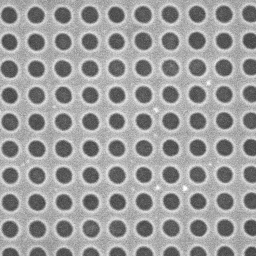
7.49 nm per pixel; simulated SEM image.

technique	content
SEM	a regular array of holes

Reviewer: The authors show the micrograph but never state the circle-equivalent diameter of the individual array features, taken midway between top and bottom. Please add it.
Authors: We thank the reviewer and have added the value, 128 nm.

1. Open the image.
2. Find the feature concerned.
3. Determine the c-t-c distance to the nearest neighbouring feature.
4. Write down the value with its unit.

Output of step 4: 199 nanometers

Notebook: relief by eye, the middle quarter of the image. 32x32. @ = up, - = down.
--@@----@@@----@@@----@@-----@@-
--@@-----@@----@@@----@@@----@@-
--@@@---@@@@---@@@----@@@---@@@@
@@@@@@@@@@@@@@@@@@@@@@@@@@@@@@@@
@@@@@@@@@@@@@@@@@@@@@@@@@@@@@@@@
@@@@@@@@@@@@@@@@@@@-@@@@@@-@@@@@
--@@@---@@@----@@@----@@@---@@@@
--@@-----@@----@@@----@@-----@@-
--@@@----@@----@@@----@@@----@@-
--@@@---@@@@---@@@@--@@@@@--@@@@
@@@@@@@@@@@@@@@@@@@@@@@@@@@@@@@@
@@@@@@@@@@@@@@@@@@@@@@@@@@@@@@@@
-@@@@@--@@@@--@@@@@--@@@@---@@@@
--@@@----@@----@@@----@@@----@@-
--@@-----@@----@@@----@@@----@@-
--@@@----@@@---@@@----@@@----@@@
-@@@@@--@@@@@@@@@@@@@@@@@@@@@@@@
@@@@@@@@@@@@@@@@@@@@@@@@@@@@@@@@
@@@@@@@@@@@@@@@@@@@@@@@@@@@@@@@@
-@@@@---@@@@--@@@@@--@@@@---@@@@
--@@@----@@----@@@----@@@----@@-
--@@@----@@----@@@----@@@----@@-
--@@@---@@@@---@@@@---@@@---@@@@
@@@@@@@@@@@@@@@@@@@@@@@@@@@@@@@@
@@@@@@@@@@@@@@@@@@@@@@@@@@@@@@@@
@@@@@@@@@@@@@@@@@@@@@@@@@@-@@@@@
-@@@@---@@@----@@@----@@@---@@@@
--@@@----@@----@@@----@@-----@@-
--@@@----@@----@@@----@@@----@@-
-@@@@@--@@@@---@@@@--@@@@---@@@@
@@@@@@@@@@@@@@@@@@@@@@@@@@@@@@@@
@@@@@@@@@@@@@@@@@@@@@@@@@@@@@@@@